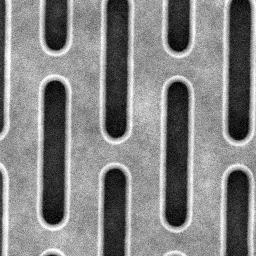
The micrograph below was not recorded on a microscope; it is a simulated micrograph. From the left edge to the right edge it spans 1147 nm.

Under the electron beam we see groups of lines, slits or small figures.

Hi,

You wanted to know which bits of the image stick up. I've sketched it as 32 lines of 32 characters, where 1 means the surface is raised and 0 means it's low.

01111000011110001111100011111000
01111000011110001111100011110000
01111000011110001111100011110000
01111000011110001111100011110000
01111000011110001111100011110000
01111100111110001111100011110000
01111101111110001111110111110000
01111111111110001111111111110000
01111111111110001111111111110000
01111111111110001111111111110000
01111100111110001111100111110000
01111000011110001111100011110000
01111000011110001111000011110000
01111000011110001111000011110001
01111000011110001111000011110001
01111000011110001111000011110001
11111000011110001111000011110001
11111000011111011111000011111001
11111000111111111111000011111111
11111000111111111111000011111111
11111000111111111111000011111111
11111000111110001111000011111001
01111000111110001111000011110001
01111000111110001111000011110001
01111000111110001111000011110001
01111000111110001111000011110001
01111000111110001111000011110001
01111000111110001111000011110001
01111111111110001111100111110001
01111111111110001111111111110001
01111111111110001111111111110001
01111111111110001111111111110001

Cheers